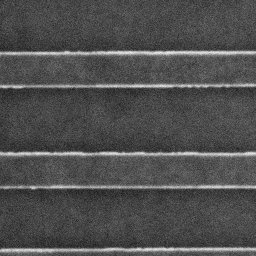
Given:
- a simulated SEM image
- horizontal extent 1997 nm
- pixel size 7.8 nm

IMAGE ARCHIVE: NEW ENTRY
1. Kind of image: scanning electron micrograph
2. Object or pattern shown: lines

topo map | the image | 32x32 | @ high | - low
--------------------------------
--------------------------------
--------------------------------
--------------------------------
--------------------------------
--------------------------------
------------@@@@@@@@@@@@@@@@@@@@
@@@@@@@@@@@@@@@@@@@@@@@@@@@@@@@@
@@@@@@@@@@@@@@@@@@@@@@@@@@@@@@@@
@@@@@@@@@@@@@@@@@@@@@@@@@@@@@@@@
@@@@@@@@@@@@@@@@@@@@@@@@@@@@@@@@
--------------------------------
--------------------------------
--------------------------------
--------------------------------
--------------------------------
--------------------------------
--------------------------------
--------------------------------
@@@@@@@@@@@@@@@@@@@@@@@@@@@@@@@@
@@@@@@@@@@@@@@@@@@@@@@@@@@@@@@@@
@@@@@@@@@@@@@@@@@@@@@@@@@@@@@@@@
@@@@@@@@@@@@@@@@@@@@@@@@@@@@@@@@
@-------------------------------
--------------------------------
--------------------------------
--------------------------------
--------------------------------
--------------------------------
--------------------------------
--------------------------------
@@@@@@@@@@@@@@@@@@@@@@@@@@@@@@@@